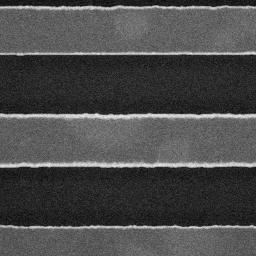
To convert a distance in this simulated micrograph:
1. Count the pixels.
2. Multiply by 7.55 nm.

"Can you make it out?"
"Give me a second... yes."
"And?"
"lines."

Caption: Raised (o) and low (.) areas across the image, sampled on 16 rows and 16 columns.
oooooooooooooooo
oooooooooooooooo
oooooooooooooooo
................
................
................
................
oooooooooooooooo
oooooooooooooooo
oooooooooooooooo
................
................
................
................
oooooooooooooooo
oooooooooooooooo